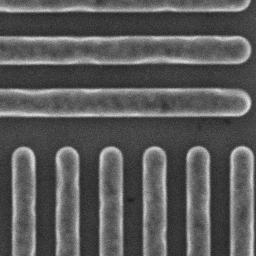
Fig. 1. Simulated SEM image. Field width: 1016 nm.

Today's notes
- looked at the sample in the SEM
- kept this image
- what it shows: groups of lines, slits or small figures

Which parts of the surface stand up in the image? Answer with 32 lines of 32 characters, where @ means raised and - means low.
@@@@@@@@@@@@@@@@@@@@@@@@@@@@@@@-
--------------------------------
--------------------------------
--------------------------------
--------------------------------
@@@@@@@@@@@@@@@@@@@@@@@@@@@@@@@-
@@@@@@@@@@@@@@@@@@@@@@@@@@@@@@@-
@@@@@@@@@@@@@@@@@@@@@@@@@@@@@@@-
--------------------------------
--------------------------------
--------------------------------
@@@@@@@@@@@@@@@@@@@@@@@@@@@@@---
@@@@@@@@@@@@@@@@@@@@@@@@@@@@@@@-
@@@@@@@@@@@@@@@@@@@@@@@@@@@@@@@-
--------------------------------
--------------------------------
--------------------------------
--------------------------------
--------@----@----------@-----@-
--@@---@@@---@@---@@@--@@@---@@@
--@@---@@@---@@---@@@--@@@---@@@
--@@---@@@--@@@---@@@--@@@---@@@
--@@----@@--@@@---@@@--@@@---@@@
--@@---@@@--@@@---@@@--@@@---@@@
--@@---@@@--@@@---@@@--@@@---@@@
--@@---@@@---@@---@@@--@@@---@@@
--@@---@@@---@@---@@@--@@@---@@@
--@@---@@@---@@---@@@--@@@---@@@
--@@---@@@---@@---@@@--@@@---@@@
--@@---@@@---@@---@@@--@@@---@@@
--@@---@@@---@@---@@@---@@---@@@
--@@---@@@---@@---@@@--@@@---@@@